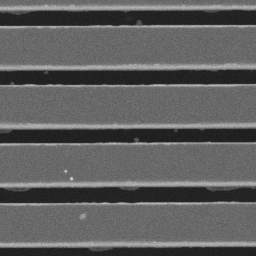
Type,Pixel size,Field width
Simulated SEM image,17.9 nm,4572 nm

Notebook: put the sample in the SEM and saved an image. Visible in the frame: lines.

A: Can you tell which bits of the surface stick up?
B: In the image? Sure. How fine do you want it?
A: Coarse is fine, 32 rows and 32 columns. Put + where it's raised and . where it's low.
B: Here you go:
++++++++++++++++++++++++++++++++
................................
................................
++++++++++++++++++++++++++++++++
++++++++++++++++++++++++++++++++
++++++++++++++++++++++++++++++++
++++++++++++++++++++++++++++++++
++++++++++++++++++++++++++++++++
++++++++++++++++++++++++++++++++
................................
................................
++++++++++++++++++++++++++++++++
++++++++++++++++++++++++++++++++
++++++++++++++++++++++++++++++++
++++++++++++++++++++++++++++++++
++++++++++++++++++++++++++++++++
................................
................................
++++++++++++++++++++++++++++++++
++++++++++++++++++++++++++++++++
++++++++++++++++++++++++++++++++
++++++++++++++++++++++++++++++++
++++++++++++++++++++++++++++++++
................................
................................
++++++++++++++++++++++++++++++++
++++++++++++++++++++++++++++++++
++++++++++++++++++++++++++++++++
++++++++++++++++++++++++++++++++
++++++++++++++++++++++++++++++++
++++++++++++++++++++++++++++++++
................................